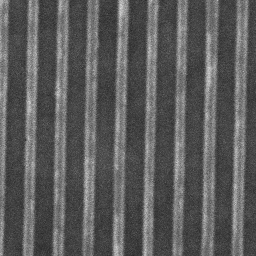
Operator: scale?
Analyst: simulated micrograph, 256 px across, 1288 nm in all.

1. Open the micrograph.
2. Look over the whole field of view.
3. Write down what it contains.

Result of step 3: parallel lines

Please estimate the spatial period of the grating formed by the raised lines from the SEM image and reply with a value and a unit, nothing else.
150 nanometers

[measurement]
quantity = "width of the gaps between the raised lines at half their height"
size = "105 nm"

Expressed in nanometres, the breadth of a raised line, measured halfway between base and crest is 45.3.